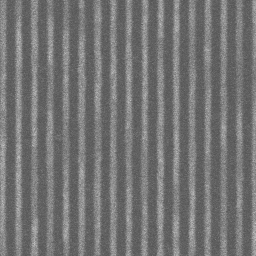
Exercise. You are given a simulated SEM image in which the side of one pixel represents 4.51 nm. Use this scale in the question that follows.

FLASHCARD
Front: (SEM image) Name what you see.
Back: parallel lines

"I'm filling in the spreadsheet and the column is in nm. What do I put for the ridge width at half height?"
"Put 24.8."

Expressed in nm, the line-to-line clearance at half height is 46.2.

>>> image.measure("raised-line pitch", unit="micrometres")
0.0712